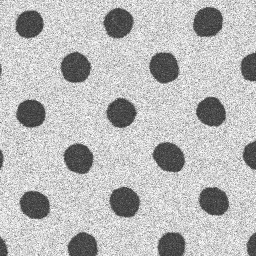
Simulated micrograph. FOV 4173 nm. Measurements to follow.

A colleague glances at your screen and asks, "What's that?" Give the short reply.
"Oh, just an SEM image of a regular array of holes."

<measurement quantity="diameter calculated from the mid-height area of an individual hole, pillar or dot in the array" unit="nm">490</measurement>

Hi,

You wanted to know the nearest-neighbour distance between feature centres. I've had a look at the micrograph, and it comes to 1.02 um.